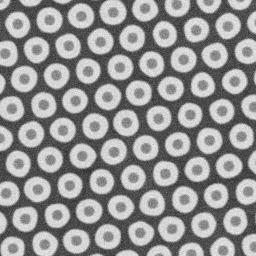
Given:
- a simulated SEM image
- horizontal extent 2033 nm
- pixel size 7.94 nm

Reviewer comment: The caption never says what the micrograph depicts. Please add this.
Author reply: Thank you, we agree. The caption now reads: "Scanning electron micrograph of an array of small figures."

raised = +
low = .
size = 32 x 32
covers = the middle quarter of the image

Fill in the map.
...++++++..++++++..++++++..+++++
+..++++++..++++++..++++++...++++
+..++++++..++++++...++++........
+...++++....++++.........+++....
+....++..........+++....+++++...
..........++....+++++...++++++..
.+++....++++++..++++++..++++++..
+++++...++++++..++++++..+++++...
++++++..++++++..++++++...++++...
++++++..++++++...++++...........
+++++....++++.................++
.++++................+++++...+++
.......+.....+++++...++++++..+++
.....+++++...+++++...++++++..+++
++...++++++.++++++...++++++..+++
+++..++++++..++++++..+++++....++
+++..++++++..+++++.....++.......
+++..+++++....+++..........+++..
++....+++..........+++....+++++.
...........++++...+++++..++++++.
...+++....+++++..++++++..++++++.
..+++++..+++++++.++++++...+++++.
..++++++.++++++...+++++...++++..
.+++++++..+++++...++++..........
..+++++...++++..........++.....+
...++++.........++.....+++++..++
........++.....+++++...+++++..++
.+.....+++++...+++++..++++++..++
++++...+++++..++++++...+++++...+
++++...+++++..++++++...+++++....
++++...+++++...+++++............
++++...+++++................++++